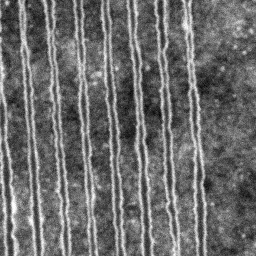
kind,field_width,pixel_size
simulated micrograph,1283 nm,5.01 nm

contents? parallel lines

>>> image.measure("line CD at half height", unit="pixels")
7.6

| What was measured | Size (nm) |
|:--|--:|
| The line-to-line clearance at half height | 98.7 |